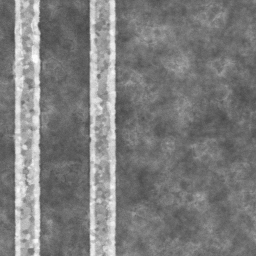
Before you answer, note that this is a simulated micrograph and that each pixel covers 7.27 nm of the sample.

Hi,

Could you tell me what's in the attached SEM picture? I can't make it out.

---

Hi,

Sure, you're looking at one or a few lines or trenches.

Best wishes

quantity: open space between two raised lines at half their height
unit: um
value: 0.401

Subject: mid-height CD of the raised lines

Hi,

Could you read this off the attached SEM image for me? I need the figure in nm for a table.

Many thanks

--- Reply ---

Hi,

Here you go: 148